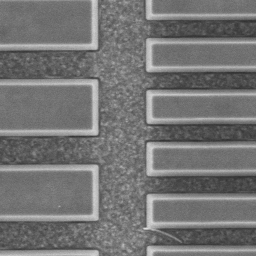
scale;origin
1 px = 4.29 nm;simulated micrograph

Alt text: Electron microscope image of groups of lines, slits or small figures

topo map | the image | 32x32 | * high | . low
************.......*************
************.......*************
************....................
************....................
************....................
************.......*************
...................*************
...................*************
...................*************
................................
************....................
************....................
************.......*************
************.......*************
************.......*************
************....................
************....................
................................
...................*************
...................*************
...................*************
************.......*************
************....................
************....................
************....................
************.......*************
************.......*************
...................*************
................................
................................
................................
...................*************